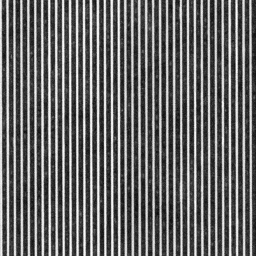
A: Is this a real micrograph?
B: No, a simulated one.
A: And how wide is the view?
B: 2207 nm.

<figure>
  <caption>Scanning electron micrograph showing parallel lines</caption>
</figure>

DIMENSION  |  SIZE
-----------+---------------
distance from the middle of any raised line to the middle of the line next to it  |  59.8 nanometers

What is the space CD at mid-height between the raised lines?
45.2 nanometers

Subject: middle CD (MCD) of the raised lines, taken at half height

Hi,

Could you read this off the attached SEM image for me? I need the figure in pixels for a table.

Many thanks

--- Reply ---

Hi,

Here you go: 1.75